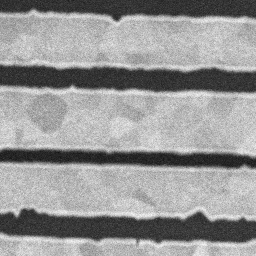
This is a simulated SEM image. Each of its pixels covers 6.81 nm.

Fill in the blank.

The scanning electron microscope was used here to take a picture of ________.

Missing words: one or a few lines or trenches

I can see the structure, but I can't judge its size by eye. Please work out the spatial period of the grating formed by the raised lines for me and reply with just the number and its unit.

506 nm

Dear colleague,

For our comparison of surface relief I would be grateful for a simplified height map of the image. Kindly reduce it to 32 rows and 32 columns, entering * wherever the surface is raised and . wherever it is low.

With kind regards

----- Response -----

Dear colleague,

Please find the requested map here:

................................
................................
**************.**************.*.
********************************
********************************
********************************
********************************
********************************
..................*...**....****
................................
................................
**************..*...............
********************************
********************************
********************************
********************************
********************************
********************************
........************************
................................
................................
********************************
********************************
********************************
********************************
********************************
......******************..******
................................
................................
*...............................
*******************.*******....*
********************************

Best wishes